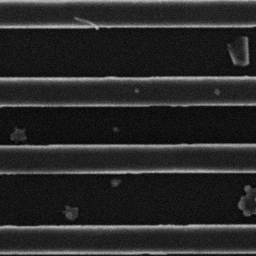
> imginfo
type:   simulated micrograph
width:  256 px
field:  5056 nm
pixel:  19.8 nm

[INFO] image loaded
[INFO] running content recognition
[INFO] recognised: lines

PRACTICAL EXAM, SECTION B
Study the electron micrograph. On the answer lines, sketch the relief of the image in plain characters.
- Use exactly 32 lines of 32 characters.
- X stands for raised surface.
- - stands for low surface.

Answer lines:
XXXXXXXXXXXXXXXXXXXXXXXXXXXXXXXX
XXXXXXXXXXXXXXXXXXXXXXXXXXXXXXXX
XXXXXXXXXXXXXXXXXXXXXXXXXXXXXXXX
--------------------------------
--------------------------------
--------------------------------
--------------------------------
--------------------------------
--------------------------------
--------------------------------
XXXXXXXXXXXXXXXXXXXXXXXXXXXXXXXX
XXXXXXXXXXXXXXXXXXXXXXXXXXXXXXXX
XXXXXXXXXXXXXXXXXXXXXXXXXXXXXXXX
--------------------------------
--------------------------------
--------------------------------
--------------------------------
--------------------------------
XXXXXXXXXXXXXXXXXXXXXXXXXXXXXXXX
XXXXXXXXXXXXXXXXXXXXXXXXXXXXXXXX
XXXXXXXXXXXXXXXXXXXXXXXXXXXXXXXX
XXXXXXXXXXXXXXXXXXXXXXXXXXXXXXXX
--------------------------------
--------------------------------
--------------------------------
--------------------------------
--------------------------------
--------------------------------
XXXXXXXXXXXXXXXXXXXXXXXXXXXXXXXX
XXXXXXXXXXXXXXXXXXXXXXXXXXXXXXXX
XXXXXXXXXXXXXXXXXXXXXXXXXXXXXXXX
XXXXXXXXXXXXXXXXXXXXXXXXXXXXXXXX